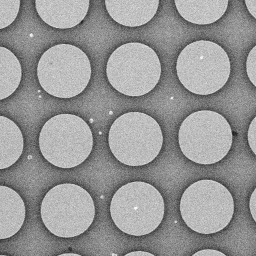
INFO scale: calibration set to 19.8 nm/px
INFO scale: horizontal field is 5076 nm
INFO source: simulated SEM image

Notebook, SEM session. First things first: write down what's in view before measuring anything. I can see an array of small figures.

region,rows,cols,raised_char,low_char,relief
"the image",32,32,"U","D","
UUDDDUUUUUUDDUUUUUUUDDUUUUUUDDDU
UUDDDUUUUUUDDDUUUUUDDDUUUUUUDDDU
UUDDDUUUUUDDDDUUUUUDDDDUUUUDDDDD
DDDDDDDDDDDDDDDDDDDDDDDDDDDDDDDD
DDDDDDDDDDDDDDDDDDDDDDDDDDDDDDDD
DDDDDDDDDDDDDDDDUUDDDDDDUUUDDDDD
UDDDDDUUUUDDDDUUUUUDDDDUUUUUDDDU
UUDDDUUUUUUDDDUUUUUUDDUUUUUUUDDU
UUUDDUUUUUUDDUUUUUUUDDUUUUUUUDDU
UUUDDUUUUUUDDUUUUUUUDDUUUUUUUDDU
UUDDDUUUUUUDDDUUUUUDDDDUUUUUDDDD
UUDDDDUUUUDDDDDUUUDDDDDDUUUDDDDD
DDDDDDDDDDDDDDDDDDDDDDDDDDDDDDDD
DDDDDDDDDDDDDDDDDDDDDDDDDDDDDDDD
DDDDDDDUUDDDDDDUUUUDDDDDUUUUDDDD
UUDDDDUUUUUDDDUUUUUUDDDUUUUUUDDU
UUUDDUUUUUUDDDUUUUUUDDUUUUUUUDDU
UUUDDUUUUUUUDDUUUUUUDDUUUUUUUDDU
UUUDDUUUUUUDDDUUUUUUDDDUUUUUUDDU
UUDDDDUUUUUDDDUUUUUUDDDUUUUUDDDD
UDDDDDDUUUDDDDDDUUDDDDDDDDDDDDDD
DDDDDDDDDDDDDDDDDDDDDDDDDDDDDDDD
DDDDDDDDDDDDDDDDDDDDDDDDDDDDDDDD
UDDDDDDUUUDDDDDUUUUDDDDDUUUUDDDD
UUDDDDUUUUUDDDUUUUUUDDDUUUUUUDDU
UUUDDUUUUUUUDDUUUUUUDDDUUUUUUDDU
UUUDDUUUUUUUDDUUUUUUDDDUUUUUUDDU
UUUDDUUUUUUUDDUUUUUUDDDUUUUUUDDD
UUDDDDUUUUUDDDDUUUUDDDDDUUUUDDDD
UDDDDDDUUDDDDDDDDDDDDDDDDDDDDDDD
DDDDDDDDDDDDDDDDDDDDDDDDDDDDDDDD
DDDDDDDDDDDDDDDDDUDDDDDDDUUDDDDD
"